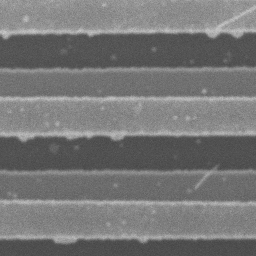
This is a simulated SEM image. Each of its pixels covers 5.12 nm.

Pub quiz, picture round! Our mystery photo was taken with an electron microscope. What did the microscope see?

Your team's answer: lines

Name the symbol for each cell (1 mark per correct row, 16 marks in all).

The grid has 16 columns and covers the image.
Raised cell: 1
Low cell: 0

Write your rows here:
1111111111111111
1111111111111111
0000000000000000
0000000000000000
1111111111111111
1111111111111111
1111111111111111
1111111111111111
0100110100000000
0000000000000000
0000000000000000
1111111111111111
1111111111111111
1111111111111111
1111111111111111
0000000000000000